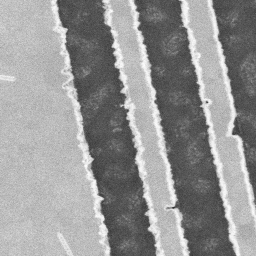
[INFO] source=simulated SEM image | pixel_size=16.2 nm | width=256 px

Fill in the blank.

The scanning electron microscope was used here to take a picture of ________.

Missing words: one or a few lines or trenches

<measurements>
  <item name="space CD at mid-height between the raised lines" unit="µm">0.824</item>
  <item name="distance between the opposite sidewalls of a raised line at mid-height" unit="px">25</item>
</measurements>